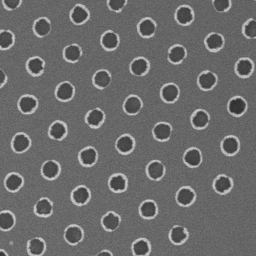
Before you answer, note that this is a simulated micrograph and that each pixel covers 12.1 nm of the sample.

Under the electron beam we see a regular array of holes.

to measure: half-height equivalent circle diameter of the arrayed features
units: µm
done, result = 0.189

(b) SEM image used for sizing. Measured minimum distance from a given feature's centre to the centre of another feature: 472 nm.